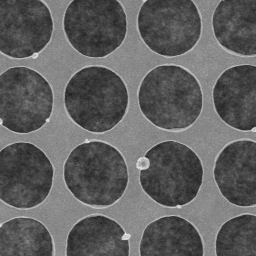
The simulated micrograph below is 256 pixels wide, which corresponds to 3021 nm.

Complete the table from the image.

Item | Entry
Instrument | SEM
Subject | holes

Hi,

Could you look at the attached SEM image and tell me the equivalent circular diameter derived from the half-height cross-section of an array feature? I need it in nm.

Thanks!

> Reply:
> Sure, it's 761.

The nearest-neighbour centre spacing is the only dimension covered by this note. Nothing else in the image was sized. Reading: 879 nm